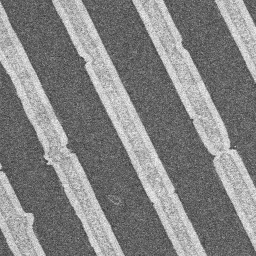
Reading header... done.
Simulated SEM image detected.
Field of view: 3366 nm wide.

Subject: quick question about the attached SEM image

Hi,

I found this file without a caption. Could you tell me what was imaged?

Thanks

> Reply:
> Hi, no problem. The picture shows one or a few lines or trenches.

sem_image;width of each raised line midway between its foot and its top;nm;258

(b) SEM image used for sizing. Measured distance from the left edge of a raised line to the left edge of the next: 960 nm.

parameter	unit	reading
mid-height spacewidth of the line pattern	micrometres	0.696